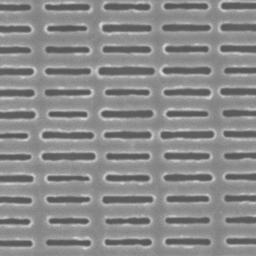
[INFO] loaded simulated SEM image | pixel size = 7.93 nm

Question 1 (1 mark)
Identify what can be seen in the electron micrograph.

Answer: a regular array of holes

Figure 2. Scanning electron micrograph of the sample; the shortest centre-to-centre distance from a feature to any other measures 168 nanometres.